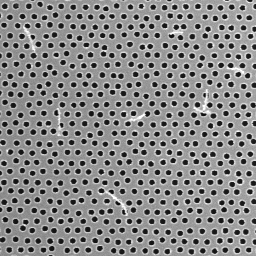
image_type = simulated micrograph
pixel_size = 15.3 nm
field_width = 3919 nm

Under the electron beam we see a regular array of holes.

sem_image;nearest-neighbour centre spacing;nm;147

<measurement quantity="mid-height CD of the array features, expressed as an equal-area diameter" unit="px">5.64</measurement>